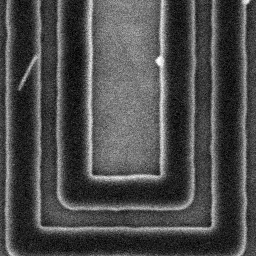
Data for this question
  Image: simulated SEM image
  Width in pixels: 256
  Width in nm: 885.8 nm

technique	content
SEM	groups of lines, slits or small figures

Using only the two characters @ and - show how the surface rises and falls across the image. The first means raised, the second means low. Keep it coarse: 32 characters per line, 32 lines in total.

-@@@@--@@@@---------@@@@---@@@@-
-@@@@--@@@@---------@@@@---@@@@-
-@@@@--@@@@---------@@@@---@@@@-
-@@@@--@@@@---------@@@@---@@@@-
-@@@@--@@@@---------@@@@---@@@@-
-@@@@--@@@@---------@@@@---@@@@-
-@@@@--@@@@---------@@@@---@@@@-
-@@@@--@@@@---------@@@@--@@@@@-
-@@@@--@@@@---------@@@@---@@@@-
-@@@@--@@@@---------@@@@---@@@@-
-@@@@--@@@@---------@@@@---@@@@-
-@@@@--@@@@---------@@@@---@@@@-
-@@@@--@@@@---------@@@@---@@@@-
-@@@@--@@@@---------@@@@---@@@@-
-@@@@--@@@@---------@@@@---@@@@-
-@@@@--@@@@---------@@@@---@@@@-
-@@@@--@@@@---------@@@@---@@@@-
-@@@@--@@@@---------@@@@--@@@@@-
-@@@@--@@@@---------@@@@--@@@@@-
-@@@@--@@@@---------@@@@--@@@@@-
-@@@@--@@@@---------@@@@---@@@@-
-@@@@--@@@@---------@@@@---@@@@-
-@@@@--@@@@@@@@@@@@@@@@@---@@@@-
-@@@@--@@@@@@@@@@@@@@@@@---@@@@-
-@@@@--@@@@@@@@@@@@@@@@@---@@@@-
-@@@@---@@@@@@@@@@@@@@@@---@@@@-
-@@@@----------------------@@@@-
-@@@@----------------------@@@@-
-@@@@@@@@@@@@@@@@@@@@@@@@@@@@@@-
-@@@@@@@@@@@@@@@@@@@@@@@@@@@@@@-
-@@@@@@@@@@@@@@@@@@@@@@@@@@@@@@-
-@@@@@@@@@@@@@@@@@@@@@@@@@@@@@--